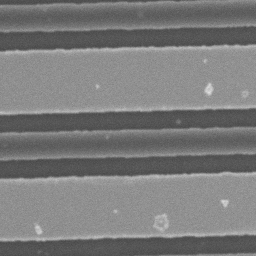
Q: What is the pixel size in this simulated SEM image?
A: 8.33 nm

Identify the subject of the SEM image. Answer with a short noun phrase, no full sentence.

lines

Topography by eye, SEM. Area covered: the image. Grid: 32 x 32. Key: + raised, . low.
............++++++++++++++++++++
++++++++++++++++++++++++++++++++
++++++++++++++++++++++++++++++++
++++++++++++++++++++++..........
................................
................................
..++++++++++++++++++++++++++++++
++++++++++++++++++++++++++++++++
++++++++++++++++++++++++++++++++
++++++++++++++++++++++++++++++++
++++++++++++++++++++++++++++++++
++++++++++++++++++++++++++++++++
++++++++++++++++++++++++++++++++
+++++++++++++++++++++++++++.....
................................
................................
.........+++++++++++++++++++++++
++++++++++++++++++++++++++++++++
++++++++++++++++++++++++++++++++
+++++++++++++++++++.............
................................
................................
......++++++++++++++++++++++++++
++++++++++++++++++++++++++++++++
++++++++++++++++++++++++++++++++
++++++++++++++++++++++++++++++++
++++++++++++++++++++++++++++++++
++++++++++++++++++++++++++++++++
++++++++++++++++++++++++++++++++
+++++++++++++++++++..+..........
................................
................................